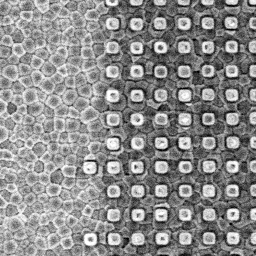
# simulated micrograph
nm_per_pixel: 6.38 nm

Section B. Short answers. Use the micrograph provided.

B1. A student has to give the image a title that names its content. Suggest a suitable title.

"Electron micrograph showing a regular array of raised bodies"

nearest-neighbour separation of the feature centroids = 23.5 px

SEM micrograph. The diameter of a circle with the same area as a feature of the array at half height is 79.1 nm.